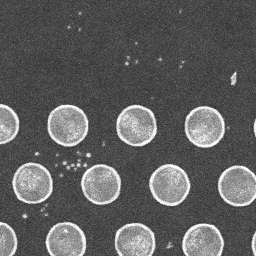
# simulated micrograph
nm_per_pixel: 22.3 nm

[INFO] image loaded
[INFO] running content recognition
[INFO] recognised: raised bodies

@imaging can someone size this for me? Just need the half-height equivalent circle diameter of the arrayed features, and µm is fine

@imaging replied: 0.859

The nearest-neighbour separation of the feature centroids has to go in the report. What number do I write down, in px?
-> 68